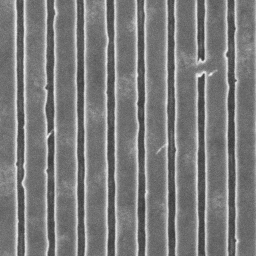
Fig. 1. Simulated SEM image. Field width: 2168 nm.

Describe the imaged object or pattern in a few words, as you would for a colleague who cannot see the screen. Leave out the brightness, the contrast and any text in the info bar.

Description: parallel lines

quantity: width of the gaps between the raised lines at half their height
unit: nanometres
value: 63.5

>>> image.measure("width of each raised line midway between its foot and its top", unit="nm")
190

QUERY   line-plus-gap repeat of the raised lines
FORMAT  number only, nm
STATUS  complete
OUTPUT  255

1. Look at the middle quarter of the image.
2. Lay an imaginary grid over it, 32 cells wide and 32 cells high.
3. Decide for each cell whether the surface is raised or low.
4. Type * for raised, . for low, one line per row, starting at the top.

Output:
***..*****...*****..******..****
***..*****...*****...*****..****
***..******..*****..******..****
***..******..*****..******..****
***..*****...*****..******..****
***..*****...*****..******..****
***..*****...*****...*****..****
***..*****...*****...*****..****
***..*****...*****...*****..****
***..*****...*****..******..****
***..*****...*****..******..****
***..******..*****..******..****
***..******..*****..******..****
***..*****...*****..******..****
***..******..*****..******..****
***..******..******.******..****
***..******..*****..******..****
***..******..*****..******..****
***..******..*****..******..****
***..******..*****..******..****
***..******..*****..******..****
***..******..*****..******..****
***..******..*****..******..****
***..******..*****..******..****
***..******..*****..******..****
***..******..*****..******..****
***..******..*****..******..****
***..******..*****..******..****
***..******..*****...*****..****
***..******..*****...*****..****
***..******..*****...*****..****
***..******..*****...*****..****